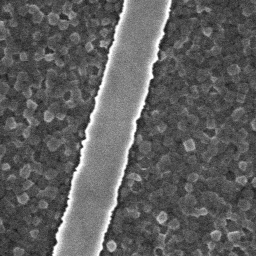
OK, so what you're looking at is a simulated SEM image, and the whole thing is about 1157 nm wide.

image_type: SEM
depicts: one or a few lines or trenches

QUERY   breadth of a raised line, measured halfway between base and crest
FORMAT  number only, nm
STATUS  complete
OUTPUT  203